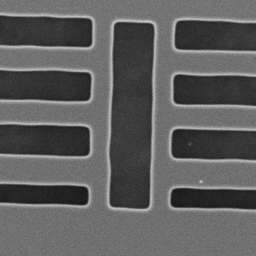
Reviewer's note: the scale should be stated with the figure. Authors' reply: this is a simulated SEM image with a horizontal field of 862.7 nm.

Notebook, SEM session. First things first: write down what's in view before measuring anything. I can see groups of lines, slits or small figures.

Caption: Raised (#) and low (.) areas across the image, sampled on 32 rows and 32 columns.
################################
################################
...........############...######
............##.....###..........
............##.....###..........
...........###.....###..........
##############.....#############
##############.....#############
##############.....#############
...........###.....###..........
...........###.....###..........
...........###.....###..........
#..........###.....###..........
##############.....#############
##############.....#############
##############.....#############
...........###.....###..........
...........###.....##...........
...........###.....##...........
#######...####.....###..........
##############.....#############
##############.....#############
##############.....#############
...........###.....###..########
...........###.....##...........
####.......###.....##...........
################################
################################
################################
################################
################################
################################